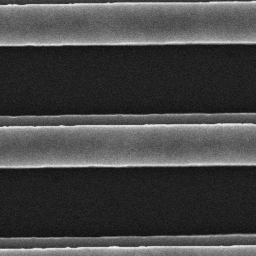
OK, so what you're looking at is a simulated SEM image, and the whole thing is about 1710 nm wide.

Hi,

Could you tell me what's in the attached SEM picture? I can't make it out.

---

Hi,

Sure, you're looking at lines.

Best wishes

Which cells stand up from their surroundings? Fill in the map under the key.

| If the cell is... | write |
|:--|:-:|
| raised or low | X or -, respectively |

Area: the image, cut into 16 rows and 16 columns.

XXXXXXXXXXXXXXXX
XXXXXXXXXXXXXXXX
XXXXXXXXXXXXXXXX
----------------
----------------
----------------
----------------
XXXXXXXXXXXXXXXX
XXXXXXXXXXXXXXXX
XXXXXXXXXXXXXXXX
----------------
----------------
----------------
----------------
----------------
XXXXXXXXXXXXXXXX